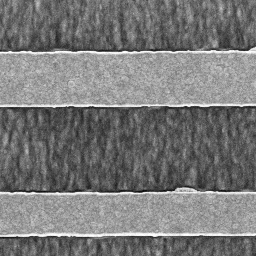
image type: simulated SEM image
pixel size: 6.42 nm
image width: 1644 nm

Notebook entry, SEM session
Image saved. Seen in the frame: lines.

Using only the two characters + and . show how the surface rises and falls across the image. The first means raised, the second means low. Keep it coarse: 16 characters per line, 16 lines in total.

................
................
................
++++++++++++++++
++++++++++++++++
++++++++++++++++
++++++++++++++++
................
................
................
................
................
++++++++++++++++
++++++++++++++++
++++++++++++++++
................